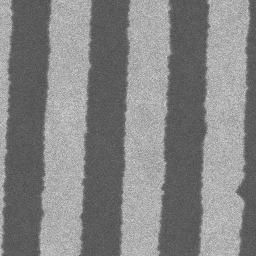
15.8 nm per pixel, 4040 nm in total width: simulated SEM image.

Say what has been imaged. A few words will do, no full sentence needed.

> one or a few lines or trenches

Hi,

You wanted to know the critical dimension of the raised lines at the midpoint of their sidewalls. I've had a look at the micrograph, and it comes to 652 nanometres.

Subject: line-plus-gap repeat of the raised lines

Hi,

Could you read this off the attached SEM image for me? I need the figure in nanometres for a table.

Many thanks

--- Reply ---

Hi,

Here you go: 1250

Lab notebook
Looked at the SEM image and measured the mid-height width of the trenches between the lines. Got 597 nm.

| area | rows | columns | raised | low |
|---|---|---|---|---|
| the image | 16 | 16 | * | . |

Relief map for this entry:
.**...**..***...
.**...**...**..*
.**...**...**..*
.**...**...**..*
***..***..***..*
***..***..***..*
***..***..***..*
***..***..***..*
***..***..***..*
***..***..***..*
***..***..***..*
***..***..***..*
***..***..***..*
***..***..***..*
***..***..***..*
***..***..***..*